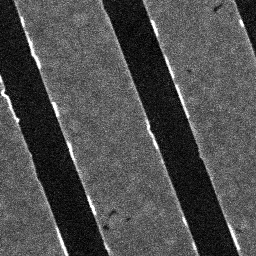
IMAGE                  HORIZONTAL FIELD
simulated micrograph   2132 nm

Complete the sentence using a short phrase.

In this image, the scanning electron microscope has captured one or a few lines or trenches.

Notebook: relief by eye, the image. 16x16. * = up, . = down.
.*****...******.
.******...*****.
..*****...******
..******..******
...*****...*****
...*****...*****
*..******..*****
*...*****...****
*...******..****
**..******..****
**...*****...***
**...******..***
***...*****...**
***...*****...**
****...*****...*
****...*****...*